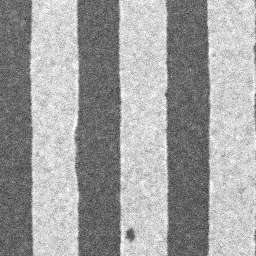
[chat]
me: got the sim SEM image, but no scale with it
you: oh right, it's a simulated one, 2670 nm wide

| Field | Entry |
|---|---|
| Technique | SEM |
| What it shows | one or a few lines or trenches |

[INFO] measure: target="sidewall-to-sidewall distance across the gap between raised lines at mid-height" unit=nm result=452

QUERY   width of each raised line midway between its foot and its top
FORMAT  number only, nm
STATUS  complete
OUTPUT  457